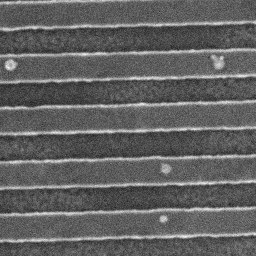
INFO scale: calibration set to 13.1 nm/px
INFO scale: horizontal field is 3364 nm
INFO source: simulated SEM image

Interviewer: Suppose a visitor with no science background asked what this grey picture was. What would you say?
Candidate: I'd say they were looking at lines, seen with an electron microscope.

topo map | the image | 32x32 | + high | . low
++++++++++++++++++++++++++++++++
++++++++++++++++++++++++++++++++
++++++++++++++++++++++++++++++++
+++++++.........................
................................
................................
.....................+++++++++++
++++++++++++++++++++++++++++++++
++++++++++++++++++++++++++++++++
+++++++++++++++++++++++++++++++.
................................
................................
................................
+.++++++++++++++++++++++++++++++
++++++++++++++++++++++++++++++++
++++++++++++++++++++++++++++++++
++++++++++++++..................
................................
................................
...............................+
++++++++++++++++++++++++++++++++
++++++++++++++++++++++++++++++++
++++++++++++++++++++++++++++++++
+++++...........................
................................
................................
............+.++++++++++++++++++
++++++++++++++++++++++++++++++++
++++++++++++++++++++++++++++++++
+++++++++++++++++++++++++.++....
................................
................................